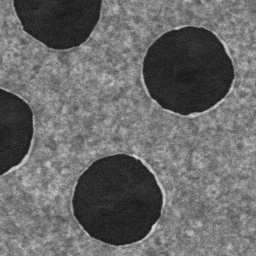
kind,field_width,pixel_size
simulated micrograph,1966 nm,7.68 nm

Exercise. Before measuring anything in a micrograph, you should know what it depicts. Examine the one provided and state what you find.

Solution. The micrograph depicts holes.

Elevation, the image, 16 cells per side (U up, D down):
UDDDDDUUUUUUUUUU
UDDDDDUUUUUUUUUU
UUDDDUUUUUDDDDUU
UUUUUUUUUDDDDDUU
UUUUUUUUUDDDDDDU
UUUUUUUUUDDDDDUU
DDUUUUUUUUDDDDUU
DDUUUUUUUUUUUUUU
DDUUUUUUUUUUUUUU
DDUUUUUUUUUUUUUU
DUUUUDDDDUUUUUUU
UUUUUDDDDDUUUUUU
UUUUUDDDDDUUUUUU
UUUUUDDDDDUUUUUU
UUUUUDDDDUUUUUUU
UUUUUUUUUUUUUUUU